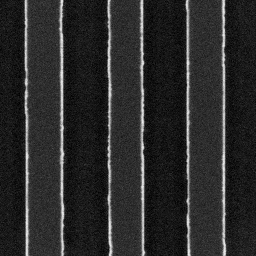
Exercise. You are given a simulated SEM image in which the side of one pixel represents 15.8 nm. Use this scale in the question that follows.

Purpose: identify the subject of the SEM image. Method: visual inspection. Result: lines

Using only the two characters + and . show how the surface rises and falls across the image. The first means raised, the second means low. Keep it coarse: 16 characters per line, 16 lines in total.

..++...++...++..
..++...++...++..
..++...++...++..
..++...++...++..
..++...++...++..
..++...++...++..
..++...++...++..
..++...++...++..
..++...++...++..
..++...++...++..
..++...++...++..
..++...++...++..
..++...++...++..
..++...++...++..
..++...++...++..
..++...++...++..